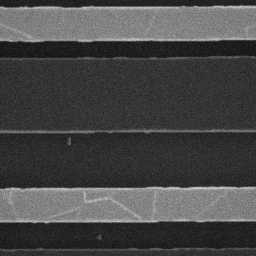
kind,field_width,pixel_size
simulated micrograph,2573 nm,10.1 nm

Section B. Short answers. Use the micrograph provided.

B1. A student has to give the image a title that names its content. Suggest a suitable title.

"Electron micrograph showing lines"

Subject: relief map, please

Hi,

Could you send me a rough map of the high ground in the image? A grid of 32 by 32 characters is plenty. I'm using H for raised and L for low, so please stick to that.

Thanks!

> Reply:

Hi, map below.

LLLLLLLLLLLLLLLLLLLLLLLLLLLLLLLL
HHHHHHHHHHHHHHHHHHHHHHHHHHHHHHHH
HHHHHHHHHHHHHHHHHHHHHHHHHHHHHHHH
HHHHHHHHHHHHHHHHHHHHHHHHHHHHHHHH
HHHHHHHHHHHHHHHHHHHHHHHHHHHHHHHH
LLLLLLLLLLLLLLLLLLLLLLLLLLLLLLLL
LLLLLLLLLLLLLLLLLLLLLLLLLLLLLLLL
HHHHHHHHHHHHHHHHHHHHHHHHHHHHHHHH
HHHHHHHHHHHHHHHHHHHHHHHHHHHHHHHH
HHHHHHHHHHHHHHHHHHHHHHHHHHHHHHHH
HHHHHHHHHHHHHHHHHHHHHHHHHHHHHHHH
HHHHHHHHHHHHHHHHHHHHHHHHHHHHHHHH
HHHHHHHHHHHHHHHHHHHHHHHHHHHHHHHH
HHHHHHHHHHHHHHHHHHHHHHHHHHHHHHHH
HHHHHHHHHHHHHHHHHHHHHHHHHHHHHHHH
HHHHHHHHHHHHHHHHHHHHHHHHHHHHHHHH
HHHHHHHHHHLLLLLLLLLLLLLLLLLLLLLL
LLLLLLLLLLLLLLLLLLLLLLLLLLLLLLLL
LLLLLLLLLLLLLLLLLLLLLLLLLLLLLLLL
LLLLLLLLLLLLLLLLLLLLLLLLLLLLLLLL
LLLLLLLLLLLLLLLLLLLLLLLLLLLLLLLL
LLLLLLLLLLLLLLLLLLLLLLLLLLLLLLLL
LLLLLLLLLLLLLLLLLLLLLLLLLLLLLLLL
LLLLLLLLLLLLLLLLLLHHHHHHHHHHHHHH
HHHHHHHHHHHHHHHHHHHHHHHHHHHHHHHH
HHHHHHHHHHHHHHHHHHHHHHHHHHHHHHHH
HHHHHHHHHHHHHHHHHHHHHHHHHHHHHHHH
HHHHHHHHHHHHHHHHHHHHHHHHHHHHHHHH
LLLLLLLLLLLLLLLLLLLLLLLLLLLLLLLL
LLLLLLLLLLLLLLLLLLLLLLLLLLLLLLLL
LLLLLLLLLLLLLLLLLLLLLLLLLLLLLLLL
HHHHHHHHHHHHHHHHHHHHHHHHHHHHHHHH